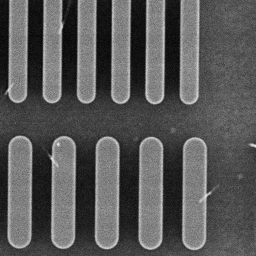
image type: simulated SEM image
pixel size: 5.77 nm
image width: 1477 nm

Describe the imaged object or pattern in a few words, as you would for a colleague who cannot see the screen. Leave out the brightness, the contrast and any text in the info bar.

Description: groups of lines, slits or small figures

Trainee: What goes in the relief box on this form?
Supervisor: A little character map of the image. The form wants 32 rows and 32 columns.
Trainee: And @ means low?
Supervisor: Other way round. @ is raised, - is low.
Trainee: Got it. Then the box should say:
-@@--@@@--@@--@@--@@@--@@-------
-@@--@@@--@@--@@--@@@--@@-------
-@@--@@@--@@--@@--@@@--@@-------
-@@--@@@--@@--@@--@@@--@@-------
-@@--@@@--@@--@@--@@@--@@-------
-@@--@@@--@@--@@--@@@--@@-------
-@@--@@@--@@--@@--@@@--@@-------
-@@--@@@--@@--@@--@@@--@@-------
-@@--@@@--@@--@@--@@@--@@-------
-@@--@@@--@@--@@--@@@--@@-------
-@@--@@@--@@--@@--@@---@@-------
-@@--@@@--@@--@@--@@---@@-------
--@---@---@@--@@--@@---@@-------
--------------------------------
--------------------------------
--------------------------------
--------------------------------
--@@---@@---@@----@@----@-------
-@@@---@@---@@@---@@---@@@------
-@@@--@@@---@@@---@@---@@@------
-@@@---@@---@@@---@@---@@@------
-@@@---@@---@@@--@@@---@@@------
-@@@---@@---@@@--@@@---@@@------
-@@@---@@---@@@--@@@---@@@------
-@@@---@@---@@@--@@@---@@@------
-@@@--@@@---@@@--@@@---@@@------
-@@@--@@@---@@@--@@@---@@@------
-@@@--@@@---@@@--@@@---@@@------
-@@@--@@@---@@@--@@@---@@@------
-@@@--@@@---@@@--@@@---@@@------
-@@@---@@---@@@---@@---@@-------
--------------------------------